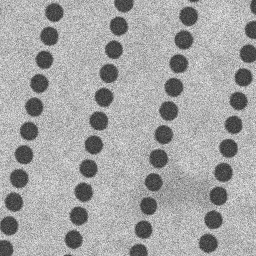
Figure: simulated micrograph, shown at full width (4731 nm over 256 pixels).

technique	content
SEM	a regular array of holes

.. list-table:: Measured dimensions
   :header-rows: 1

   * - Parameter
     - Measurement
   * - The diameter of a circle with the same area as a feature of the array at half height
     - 18.9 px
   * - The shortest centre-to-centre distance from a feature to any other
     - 447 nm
